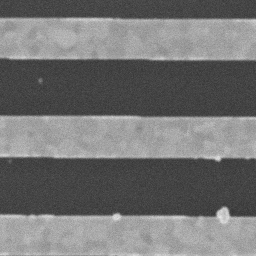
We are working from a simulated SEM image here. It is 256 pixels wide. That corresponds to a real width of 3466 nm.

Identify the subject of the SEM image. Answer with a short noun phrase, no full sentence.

lines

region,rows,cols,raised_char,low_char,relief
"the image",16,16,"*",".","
................
****************
****************
****************
................
................
................
****************
****************
****************
................
................
................
****...*.....**.
****************
****************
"